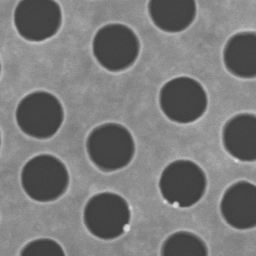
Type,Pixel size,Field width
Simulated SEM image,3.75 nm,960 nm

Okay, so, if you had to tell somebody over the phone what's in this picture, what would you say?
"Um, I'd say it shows holes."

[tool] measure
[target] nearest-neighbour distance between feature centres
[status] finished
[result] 258 nm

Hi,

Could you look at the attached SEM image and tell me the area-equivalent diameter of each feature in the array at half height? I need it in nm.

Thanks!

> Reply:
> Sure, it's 173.